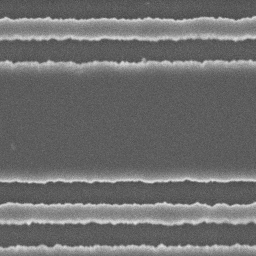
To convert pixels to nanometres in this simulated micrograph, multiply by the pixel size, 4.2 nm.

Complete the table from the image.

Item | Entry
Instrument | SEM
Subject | lines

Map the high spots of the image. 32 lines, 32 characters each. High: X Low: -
--------------------------------
--------------------------------
XXXXXXXXXXXXXXXXXXXXXX-XXXXXX-XX
XXXXXXXXXXXXXXXXXXXXXXXXXXXXXXXX
XXXXXXXXXXXXXXXXXXXXXXXXXXXXXXXX
--------------------------------
--------------------------------
--------------------------------
XXXXXXXXXXXXXXXXXXXXXXXXXXXXXXXX
XXXXXXXXXXXXXXXXXXXXXXXXXXXXXXXX
XXXXXXXXXXXXXXXXXXXXXXXXXXXXXXXX
XXXXXXXXXXXXXXXXXXXXXXXXXXXXXXXX
XXXXXXXXXXXXXXXXXXXXXXXXXXXXXXXX
XXXXXXXXXXXXXXXXXXXXXXXXXXXXXXXX
XXXXXXXXXXXXXXXXXXXXXXXXXXXXXXXX
XXXXXXXXXXXXXXXXXXXXXXXXXXXXXXXX
XXXXXXXXXXXXXXXXXXXXXXXXXXXXXXXX
XXXXXXXXXXXXXXXXXXXXXXXXXXXXXXXX
XXXXXXXXXXXXXXXXXXXXXXXXXXXXXXXX
XXXXXXXXXXXXXXXXXXXXXXXXXXXXXXXX
XXXXXXXXXXXXXXXXXXXXXXXXXXXXXXXX
XXXXXXXXXXXXXXXXXXXXXXXXXXXXXXXX
XXXXXXXXXXXXXXXXXXXXXXX-XXXXXXXX
--------------------------------
--------------------------------
XXXX----XXXXX---X--XX---X--X---X
XXXXXXXXXXXXXXXXXXXXXXXXXXXXXXXX
XXXXXXXXXXXXXXXXXXXXXXXXXXXXXXXX
--------------------------------
--------------------------------
--------------------------------
XXXXXXXXXXXXXXXXXXXXXXXXXXXXXXXX